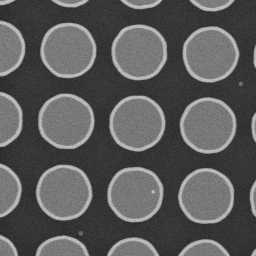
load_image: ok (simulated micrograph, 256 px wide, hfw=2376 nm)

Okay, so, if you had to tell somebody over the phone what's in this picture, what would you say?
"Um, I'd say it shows an array of small figures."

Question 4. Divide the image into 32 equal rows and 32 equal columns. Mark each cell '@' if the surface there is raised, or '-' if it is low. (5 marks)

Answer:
@------@@@------@@@@----@@@@@---
--------------------------------
--------------------------------
@@----@@@@@-----@@@------@@-----
@@@---@@@@@----@@@@@----@@@@@---
@@@--@@@@@@@--@@@@@@@--@@@@@@@--
@@@--@@@@@@@--@@@@@@@--@@@@@@@--
@@@--@@@@@@@--@@@@@@@--@@@@@@@--
@@----@@@@@----@@@@@---@@@@@@---
-------@@@-----@@@@-----@@@@----
--------------------------------
--------------------------------
@@----@@@@-----@@@@------@@-----
@@@--@@@@@@---@@@@@@---@@@@@@---
@@@--@@@@@@@--@@@@@@@--@@@@@@---
@@@--@@@@@@@--@@@@@@@--@@@@@@@-@
@@@--@@@@@@---@@@@@@---@@@@@@---
@@----@@@@@---@@@@@@---@@@@@@---
-------@@-------@@@-----@@@@----
--------------------------------
--------------------------------
@@----@@@@-----@@@@-----@@@-----
@@---@@@@@@---@@@@@@---@@@@@@---
@@@--@@@@@@---@@@@@@---@@@@@@--@
@@@--@@@@@@--@@@@@@@--@@@@@@@--@
@@---@@@@@@---@@@@@@--@@@@@@@--@
@-----@@@@@---@@@@@@---@@@@@@---
-------@-------@@@------@@@@----
--------------------------------
-------@------------------------
@@---@@@@@----@@@@@-----@@@-----
@@---@@@@@@---@@@@@@---@@@@@----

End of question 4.